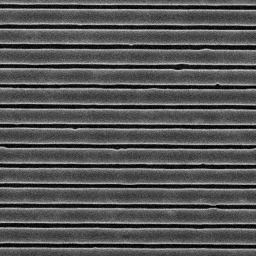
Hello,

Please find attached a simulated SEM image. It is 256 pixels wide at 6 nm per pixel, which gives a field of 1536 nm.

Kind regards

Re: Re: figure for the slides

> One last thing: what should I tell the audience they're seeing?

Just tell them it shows parallel lines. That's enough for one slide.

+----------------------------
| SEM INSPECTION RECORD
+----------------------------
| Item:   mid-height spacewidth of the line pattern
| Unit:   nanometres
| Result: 27.7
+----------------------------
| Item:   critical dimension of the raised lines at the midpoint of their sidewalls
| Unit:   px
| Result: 14.7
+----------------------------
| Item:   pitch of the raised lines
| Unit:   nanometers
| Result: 119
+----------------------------